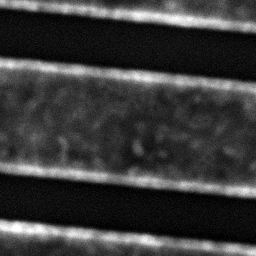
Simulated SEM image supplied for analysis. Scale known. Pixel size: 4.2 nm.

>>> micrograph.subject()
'one or a few lines or trenches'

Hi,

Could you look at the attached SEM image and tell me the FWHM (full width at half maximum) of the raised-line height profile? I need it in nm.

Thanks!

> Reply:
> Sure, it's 446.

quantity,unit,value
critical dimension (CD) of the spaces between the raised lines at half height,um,0.241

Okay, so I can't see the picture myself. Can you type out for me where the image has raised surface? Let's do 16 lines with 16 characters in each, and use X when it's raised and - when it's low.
---XXXXXXXXXXXXX
-------------XXX
----------------
----------------
XXXXXX----------
XXXXXXXXXXXXXXXX
XXXXXXXXXXXXXXXX
XXXXXXXXXXXXXXXX
XXXXXXXXXXXXXXXX
XXXXXXXXXXXXXXXX
XXXXXXXXXXXXXXXX
----------XXXXXX
----------------
----------------
XXXXX-----------
XXXXXXXXXXXXXX--